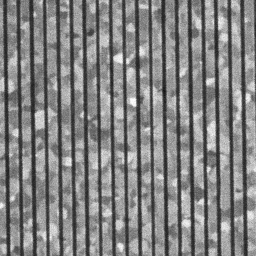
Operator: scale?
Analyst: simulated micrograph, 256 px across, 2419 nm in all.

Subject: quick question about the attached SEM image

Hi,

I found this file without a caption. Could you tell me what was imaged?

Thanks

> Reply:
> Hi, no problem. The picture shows parallel lines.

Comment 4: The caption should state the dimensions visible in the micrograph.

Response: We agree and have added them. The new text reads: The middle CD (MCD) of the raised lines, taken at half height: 0.0803 microns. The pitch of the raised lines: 125 nanometers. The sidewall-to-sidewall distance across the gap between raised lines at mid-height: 40.1 nanometres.